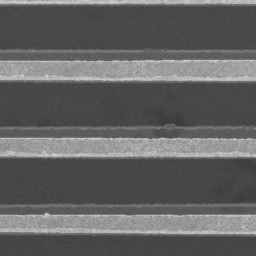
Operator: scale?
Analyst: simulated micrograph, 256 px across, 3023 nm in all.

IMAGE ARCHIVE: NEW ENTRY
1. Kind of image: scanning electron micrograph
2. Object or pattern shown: lines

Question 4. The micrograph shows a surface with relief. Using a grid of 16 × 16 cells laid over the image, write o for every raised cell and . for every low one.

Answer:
................
................
................
oooooooooooooooo
oooooooooooooooo
................
................
................
oooooooooooooooo
oooooooooooooooo
................
................
................
oooooooooooooooo
.ooooooooooooooo
................